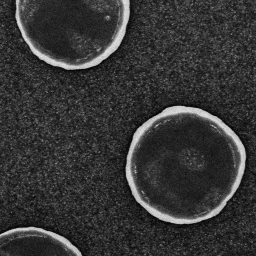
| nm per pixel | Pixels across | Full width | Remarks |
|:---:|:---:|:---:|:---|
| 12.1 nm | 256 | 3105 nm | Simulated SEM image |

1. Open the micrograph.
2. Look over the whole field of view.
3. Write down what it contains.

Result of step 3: raised bodies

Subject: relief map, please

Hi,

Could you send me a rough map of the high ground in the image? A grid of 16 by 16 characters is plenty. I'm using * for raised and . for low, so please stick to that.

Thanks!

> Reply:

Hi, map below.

.*******........
.*******........
..*****.........
..*****.........
................
................
................
..........****..
.........******.
........*******.
........*******.
........*******.
.........*****..
..........***...
***.............
****............